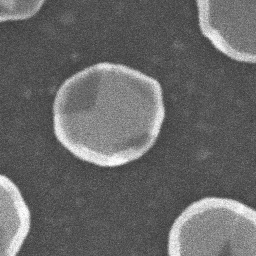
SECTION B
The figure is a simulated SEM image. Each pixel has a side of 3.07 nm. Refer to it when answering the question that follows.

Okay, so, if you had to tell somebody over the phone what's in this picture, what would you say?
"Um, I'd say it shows raised bodies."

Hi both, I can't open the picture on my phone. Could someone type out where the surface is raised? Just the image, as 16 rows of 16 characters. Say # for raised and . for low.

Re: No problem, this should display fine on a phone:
##..........####
.............###
.............###
..............##
.....###........
....######......
...#######......
....######......
....######......
.....####.......
................
#...............
#............#..
##.........#####
##.........#####
#..........#####